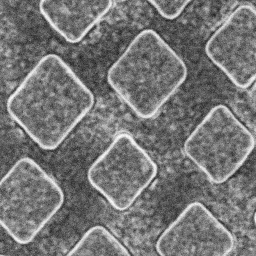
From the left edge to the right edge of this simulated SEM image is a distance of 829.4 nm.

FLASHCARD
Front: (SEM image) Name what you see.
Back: raised bodies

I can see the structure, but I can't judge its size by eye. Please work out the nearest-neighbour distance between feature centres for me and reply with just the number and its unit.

326 nm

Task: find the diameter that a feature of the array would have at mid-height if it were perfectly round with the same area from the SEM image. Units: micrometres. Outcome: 0.224